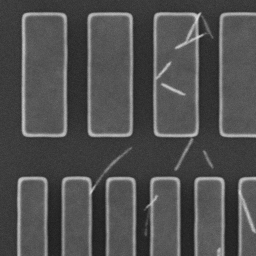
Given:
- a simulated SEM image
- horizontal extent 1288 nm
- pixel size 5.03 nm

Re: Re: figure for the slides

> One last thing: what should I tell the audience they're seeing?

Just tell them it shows groups of lines, slits or small figures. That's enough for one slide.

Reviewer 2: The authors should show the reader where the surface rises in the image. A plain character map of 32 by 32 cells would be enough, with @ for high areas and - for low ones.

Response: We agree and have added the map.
--------------------------------
--------------------------------
---@@@@@---@@@@@---@@@@@@---@@@@
---@@@@@---@@@@@---@@@@@@---@@@@
---@@@@@---@@@@@---@@@@@@---@@@@
---@@@@@---@@@@@---@@@@@@---@@@@
---@@@@@---@@@@@---@@@@@@---@@@@
---@@@@@---@@@@@---@@@@@@---@@@@
---@@@@@---@@@@@---@@@@@@---@@@@
---@@@@@---@@@@@---@@@@@@---@@@@
---@@@@@---@@@@@---@@@@@@---@@@@
---@@@@@---@@@@@---@@@@@@---@@@@
---@@@@@---@@@@@---@@@@@@---@@@@
---@@@@@---@@@@@---@@@@@@---@@@@
---@@@@@---@@@@@---@@@@@@---@@@@
---@@@@@---@@@@@---@@@@@@---@@@@
---@@@@@---@@@@@---@@@@@@---@@@@
--------------------------------
--------------------------------
--------------------------------
--------------------------------
--------------------------------
---@@@--@@@---@@@--@@@---@@@--@@
--@@@@--@@@--@@@@--@@@--@@@@--@@
--@@@@--@@@--@@@@--@@@--@@@@--@@
--@@@@--@@@--@@@@--@@@--@@@@--@@
--@@@@--@@@--@@@@--@@@--@@@@--@@
--@@@@--@@@--@@@@--@@@--@@@@--@@
--@@@@--@@@--@@@@--@@@--@@@@--@@
--@@@@--@@@--@@@@--@@@--@@@@--@@
--@@@@--@@@--@@@@--@@@--@@@@--@@
--@@@@--@@@--@@@@--@@@--@@@@--@@